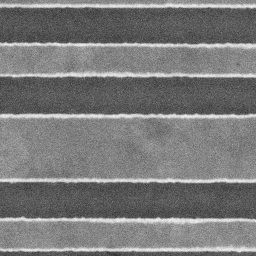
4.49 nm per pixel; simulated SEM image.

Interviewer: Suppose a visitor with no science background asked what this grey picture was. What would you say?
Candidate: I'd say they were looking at lines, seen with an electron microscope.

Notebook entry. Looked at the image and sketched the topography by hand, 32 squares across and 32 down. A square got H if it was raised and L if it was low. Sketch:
HHHHHHHHHHHHHHHHHHHHHHHHHHHHHHHH
LLLLLLLLLLLLLLLLLLLLLLLLLLLLLLLL
LLLLLLLLLLLLLLLLLLLLLLLLLLLLLLLL
LLLLLLLLLLLLLLLLLLLLLLLLLLLLLLLL
LLLLLLLLLLLLLLLLLLLLLLLLLLLLLLLL
HHHHHHHHHLLLLLLHLLLLLLLLLLLLHLLL
HHHHHHHHHHHHHHHHHHHHHHHHHHHHHHHH
HHHHHHHHHHHHHHHHHHHHHHHHHHHHHHHH
HHHHHHHHHHHHHHHHHHHHHHHHHHHHHHHH
LHHLLHHHLHHLHHHHHHHHHHLHHHHHHHHH
LLLLLLLLLLLLLLLLLLLLLLLLLLLLLLLL
LLLLLLLLLLLLLLLLLLLLLLLLLLLLLLLL
LLLLLLLLLLLLLLLLLLLLLLLLLLLLLLLL
LLLLLLLLLLLLLLLLLLLLLLLLLLLLLLLL
HHHHHHHHHHHHHHHHHHHHHHHHHHHHHHHH
HHHHHHHHHHHHHHHHHHHHHHHHHHHHHHHH
HHHHHHHHHHHHHHHHHHHHHHHHHHHHHHHH
HHHHHHHHHHHHHHHHHHHHHHHHHHHHHHHH
HHHHHHHHHHHHHHHHHHHHHHHHHHHHHHHH
HHHHHHHHHHHHHHHHHHHHHHHHHHHHHHHH
HHHHHHHHHHHHHHHHHHHHHHHHHHHHHHHH
HHHHHHHHHHHHHHHHHHHHHHHHHHHHHHHH
HHHHHHHHHHHHHHHHHHHHHHHHHHHHHHHH
LLLLLLLLLLLLLLLLLLLLLLLLLLLLLLLL
LLLLLLLLLLLLLLLLLLLLLLLLLLLLLLLL
LLLLLLLLLLLLLLLLLLLLLLLLLLLLLLLL
LLLLLLLLLLLLLLLLLLLLLLLLLLLLLLLL
HHHHHHHHHHHHHHHHHHHHHHHHHHHHHHHH
HHHHHHHHHHHHHHHHHHHHHHHHHHHHHHHH
HHHHHHHHHHHHHHHHHHHHHHHHHHHHHHHH
HHHHHHHHHHHHHHHHHHHHHHHHHHHHHHHH
LLLLLLLLLLLLLLLLLLLLLLLLLLLLLLLL